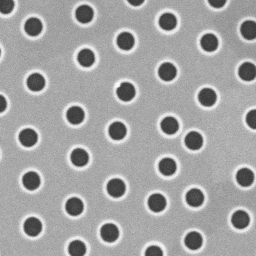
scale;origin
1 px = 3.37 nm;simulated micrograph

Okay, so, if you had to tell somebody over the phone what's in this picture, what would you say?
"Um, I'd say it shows a regular array of holes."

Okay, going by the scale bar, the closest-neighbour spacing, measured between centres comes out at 0.146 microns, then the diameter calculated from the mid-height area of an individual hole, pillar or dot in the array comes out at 71.4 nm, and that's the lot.